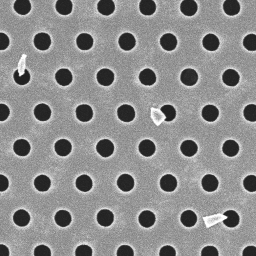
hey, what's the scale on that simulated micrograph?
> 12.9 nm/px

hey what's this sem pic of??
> a regular array of holes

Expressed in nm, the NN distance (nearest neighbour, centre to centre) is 522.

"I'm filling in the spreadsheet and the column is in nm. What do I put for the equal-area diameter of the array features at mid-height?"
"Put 227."